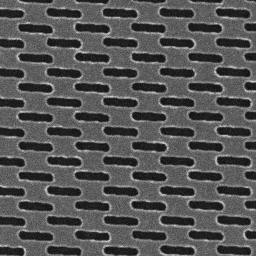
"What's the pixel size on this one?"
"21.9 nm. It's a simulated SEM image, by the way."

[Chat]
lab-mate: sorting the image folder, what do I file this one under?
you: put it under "a regular array of holes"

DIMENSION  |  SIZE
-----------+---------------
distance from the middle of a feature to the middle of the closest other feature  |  647 nanometres